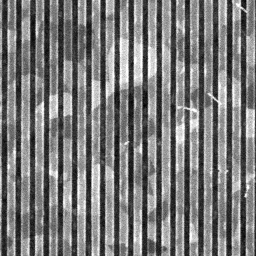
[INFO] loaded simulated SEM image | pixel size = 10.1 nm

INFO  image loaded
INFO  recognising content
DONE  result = parallel lines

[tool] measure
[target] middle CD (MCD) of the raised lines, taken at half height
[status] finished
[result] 71.7 nanometres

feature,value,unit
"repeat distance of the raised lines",142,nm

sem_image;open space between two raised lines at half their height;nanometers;65.4